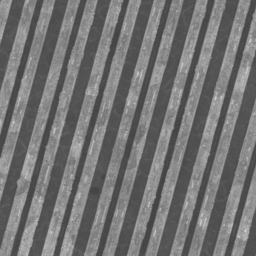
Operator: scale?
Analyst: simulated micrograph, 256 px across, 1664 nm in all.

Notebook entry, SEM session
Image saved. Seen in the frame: parallel lines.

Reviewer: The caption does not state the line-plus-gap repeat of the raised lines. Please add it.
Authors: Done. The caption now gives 134 nanometers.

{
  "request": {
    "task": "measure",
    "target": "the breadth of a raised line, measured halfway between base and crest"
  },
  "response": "10.6 pixels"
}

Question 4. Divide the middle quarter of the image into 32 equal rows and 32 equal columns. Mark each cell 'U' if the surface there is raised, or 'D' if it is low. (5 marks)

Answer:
DUUUDDDUUUDDUUDDDDUUUDDUUDDDDUUD
DUUUDDDUUUDDUUDDDDUUDDUUUDDDDUUD
DUUDDDDUUUDUUUDDDDUUDDUUUDDDUUUD
DUUDDDDUUDDUUUDDDUUUDDUUDDDDUUUD
UUUDDDUUUDDUUDDDDUUUDDUUDDDDUUDD
UUUDDDUUUDDUUDDDDUUDDUUUDDDDUUDD
UUDDDDUUDDUUUDDDUUUDDUUUDDDUUUDD
UUDDDUUUDDUUUDDDUUUDDUUDDDDUUUDU
UUDDDUUUDDUUDDDDUUDDDUUDDDDUUDDU
UDDDDUUUDDUUDDDDUUDDUUUDDDDUUDDU
UDDDDUUDDUUUDDDUUUDDUUUDDDUUUDDU
UDDDUUUDDUUDDDDUUUDDUUDDDDUUDDUU
UDDDUUUDDUUDDDDUUDDUUUDDDDUUDDUU
DDDDUUUDUUUDDDDUUDDUUUDDDUUUDDUU
DDDDUUDDUUUDDDUUUDDUUDDDDUUUDDUU
DDDUUUDDUUDDDDUUUDDUUDDDDUUDDUUU
DDDUUUDDUUDDDDUUDDUUUDDDUUUDDUUU
DDDUUDDUUUDDDDUUDDUUUDDDUUUDDUUD
DDDUUDDUUUDDDUUUDDUUDDDDUUUDUUUD
DDUUUDDUUDDDDUUDDDUUDDDDUUDDUUUD
DDUUUDDUUDDDDUUDDUUUDDDUUUDDUUDD
DDUUDDUUUDDDUUUDDUUUDDDUUUDDUUDD
DUUUDDUUDDDDUUUDDUUDDDDUUDDUUUDD
DUUUDDUUDDDDUUDDUUUDDDUUUDDUUUDD
DUUUDUUUDDDDUUDDUUUDDDUUUDDUUDDD
DUUDDUUUDDDUUUDDUUDDDDUUUDDUUDDD
UUUDDUUDDDDUUUDUUUDDDDUUUDUUUDDD
UUUDDUUDDDDUUDDUUUDDDUUUDDUUUDDD
UUUDUUUDDDDUUDDUUUDDDUUUDUUUDDDD
UUDDUUUDDDUUUDDUUDDDDUUUDUUUDDDD
UUDDUUDDDDUUDDUUUDDDDUUDDUUUDDDU
UUDDUUDDDDUUDDUUUDDDUUUDDUUUDDDU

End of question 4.